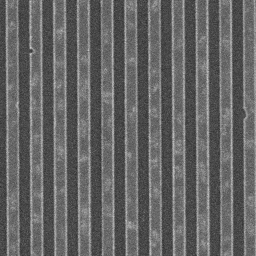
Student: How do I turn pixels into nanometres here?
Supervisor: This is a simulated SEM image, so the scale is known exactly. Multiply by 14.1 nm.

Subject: parallel lines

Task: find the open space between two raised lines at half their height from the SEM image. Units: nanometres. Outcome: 169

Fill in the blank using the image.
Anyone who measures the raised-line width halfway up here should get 169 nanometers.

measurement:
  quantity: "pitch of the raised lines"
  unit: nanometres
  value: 334